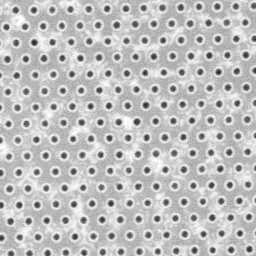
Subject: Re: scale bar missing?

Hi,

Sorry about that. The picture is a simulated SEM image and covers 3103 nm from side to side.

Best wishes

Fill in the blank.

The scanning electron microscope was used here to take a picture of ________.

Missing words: a regular array of holes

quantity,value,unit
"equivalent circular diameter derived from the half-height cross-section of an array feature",0.101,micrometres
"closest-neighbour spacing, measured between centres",220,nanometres